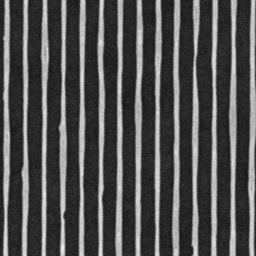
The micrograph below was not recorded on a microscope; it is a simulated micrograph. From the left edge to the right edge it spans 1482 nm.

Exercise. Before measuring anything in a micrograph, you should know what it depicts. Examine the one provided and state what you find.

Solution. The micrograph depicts parallel lines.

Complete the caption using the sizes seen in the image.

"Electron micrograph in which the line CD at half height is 25.3 nm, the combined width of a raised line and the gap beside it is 109 nm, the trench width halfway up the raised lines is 81 nm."